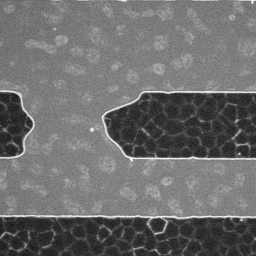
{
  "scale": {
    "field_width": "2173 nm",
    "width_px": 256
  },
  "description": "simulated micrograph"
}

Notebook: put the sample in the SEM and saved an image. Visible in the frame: one or a few lines or trenches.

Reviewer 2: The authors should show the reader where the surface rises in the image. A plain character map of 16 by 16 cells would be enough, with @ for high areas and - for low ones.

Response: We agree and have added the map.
----------------
----------------
----------------
----------------
----------------
----------------
@-------@@@@@@@@
@@----@@@@@@@@@@
@@-----@@@@@@@@@
@-------@@@@@@@@
----------------
----------------
----------------
@@@-@-----------
@@@@@@@@@@@@@@@@
@@@@@@@@@@@@@@@@